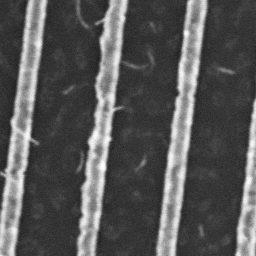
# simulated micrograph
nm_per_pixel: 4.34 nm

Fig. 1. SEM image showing one or a few lines or trenches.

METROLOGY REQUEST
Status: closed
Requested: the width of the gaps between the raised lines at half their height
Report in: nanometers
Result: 285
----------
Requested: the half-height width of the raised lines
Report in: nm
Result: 58.1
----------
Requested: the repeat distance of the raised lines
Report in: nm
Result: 344